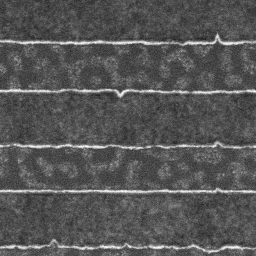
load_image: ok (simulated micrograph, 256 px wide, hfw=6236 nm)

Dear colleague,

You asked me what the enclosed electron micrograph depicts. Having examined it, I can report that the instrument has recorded one or a few lines or trenches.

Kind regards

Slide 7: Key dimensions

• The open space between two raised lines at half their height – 1360 nanometres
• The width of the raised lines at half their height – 1.14 um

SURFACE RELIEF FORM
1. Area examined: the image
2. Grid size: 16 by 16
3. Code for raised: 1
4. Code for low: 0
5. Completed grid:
0000000000000000
0000000000000000
0000000000000000
1111111111111111
1111111111111111
1111111111111111
0000000000000000
0000000000000000
0000000000000000
1111111111111111
1111111111111111
1111111111111111
0000000000000000
0000000000000000
0000000000000000
1111101111111010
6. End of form